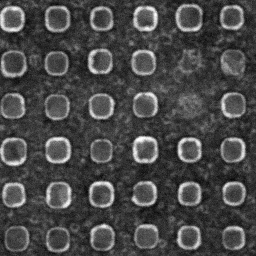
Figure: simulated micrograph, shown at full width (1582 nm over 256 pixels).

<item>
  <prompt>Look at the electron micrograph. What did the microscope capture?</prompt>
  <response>a regular array of raised bodies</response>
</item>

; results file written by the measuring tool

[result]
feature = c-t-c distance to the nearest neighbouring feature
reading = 266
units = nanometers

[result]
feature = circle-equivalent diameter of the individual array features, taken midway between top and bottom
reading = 24.6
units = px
